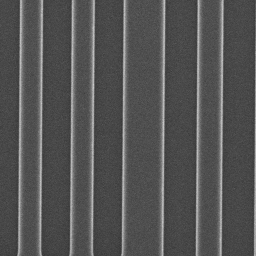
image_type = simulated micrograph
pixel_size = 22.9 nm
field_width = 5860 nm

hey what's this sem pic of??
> groups of lines, slits or small figures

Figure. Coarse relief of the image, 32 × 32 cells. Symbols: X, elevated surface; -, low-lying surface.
---XX----XXX----XXXX-----XXX----
---XX----XXX----XXXX-----XXX----
---XX----XXX----XXXX-----XXX----
---XX----XXX----XXXX-----XXX----
---XX----XXX----XXXX-----XXX----
---XX----XXX----XXXX-----XXX----
---XX----XXX----XXXX-----XXX----
---XX----XXX----XXXX-----XXX----
---XX----XXX----XXXX-----XXX----
---XX----XXX----XXXX-----XXX----
---XX----XXX---XXXXX-----XXX----
---XX----XXX---XXXXX-----XXX----
---XX----XXX---XXXXX-----XXX----
---XX----XXX---XXXXX-----XXX----
---XX----XXX---XXXXX-----XXX----
---XX----XXX---XXXXX-----XXX----
---XX----XXX---XXXXX-----XXX----
---XX----XXX---XXXXX-----XXX----
---XX----XXX---XXXXX-----XXX----
---XX----XXX---XXXXX-----XXX----
---XX----XXX---XXXXX-----XXX----
---XX----XXX---XXXXX-----XXX----
--XXX----XXX---XXXXX-----XXX----
--XXX----XXX---XXXXX-----XXX----
--XXX----XXX---XXXXX-----XXX----
--XXX----XXX---XXXXX-----XXX----
--XXX----XXX---XXXXX-----XXX----
--XXX----XXX---XXXXX-----XXX----
--XXX----XXX---XXXXX-----XXX----
--XXX----XXX---XXXXX-----XXX----
--XXX----XXX---XXXXX-----XXX----
--XXX----XXX---XXXXX-----XXX----